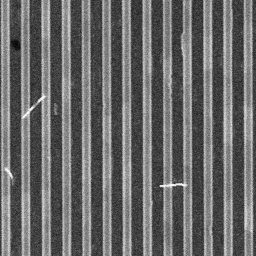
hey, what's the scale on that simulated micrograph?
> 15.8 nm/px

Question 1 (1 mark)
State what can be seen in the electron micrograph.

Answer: parallel lines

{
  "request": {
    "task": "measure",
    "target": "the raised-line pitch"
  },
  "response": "0.32 microns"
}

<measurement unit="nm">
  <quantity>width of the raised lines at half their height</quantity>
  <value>98.7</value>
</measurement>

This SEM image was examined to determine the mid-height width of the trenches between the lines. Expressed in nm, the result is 213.